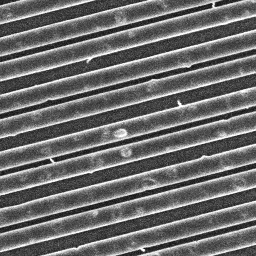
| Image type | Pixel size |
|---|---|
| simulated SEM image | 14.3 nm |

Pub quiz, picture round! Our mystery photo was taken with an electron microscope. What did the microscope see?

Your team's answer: parallel lines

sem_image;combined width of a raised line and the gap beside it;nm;395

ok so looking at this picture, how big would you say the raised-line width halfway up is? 252 nanometres